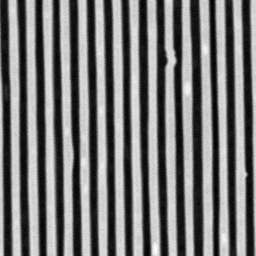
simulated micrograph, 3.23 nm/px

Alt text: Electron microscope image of parallel lines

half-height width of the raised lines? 27.1 nm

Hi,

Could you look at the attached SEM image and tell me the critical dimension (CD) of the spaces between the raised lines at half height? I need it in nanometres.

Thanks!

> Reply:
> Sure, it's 29.9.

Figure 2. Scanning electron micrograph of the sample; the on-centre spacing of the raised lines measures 55.9 nanometers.